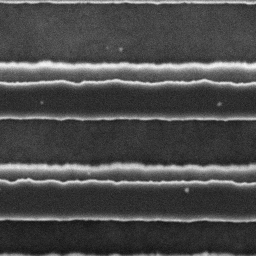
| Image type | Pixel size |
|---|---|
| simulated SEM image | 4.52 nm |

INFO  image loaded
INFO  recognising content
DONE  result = lines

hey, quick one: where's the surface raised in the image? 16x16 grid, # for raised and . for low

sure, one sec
................
................
................
................
................
################
################
................
................
................
................
################
################
################
................
................